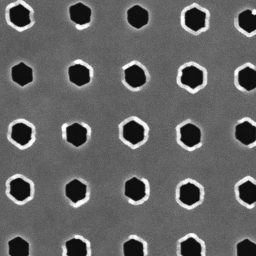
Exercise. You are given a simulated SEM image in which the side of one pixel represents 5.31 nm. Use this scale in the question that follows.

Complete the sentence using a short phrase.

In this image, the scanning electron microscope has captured a regular array of holes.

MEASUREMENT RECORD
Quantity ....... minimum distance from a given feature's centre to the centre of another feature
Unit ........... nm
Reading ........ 298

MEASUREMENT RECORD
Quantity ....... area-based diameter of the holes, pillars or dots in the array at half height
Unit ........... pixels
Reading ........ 21.8